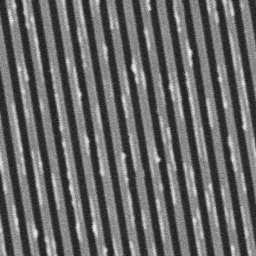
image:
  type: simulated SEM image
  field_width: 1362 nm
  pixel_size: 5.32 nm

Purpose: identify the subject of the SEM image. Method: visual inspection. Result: parallel lines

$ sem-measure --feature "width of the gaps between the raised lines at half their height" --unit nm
43.3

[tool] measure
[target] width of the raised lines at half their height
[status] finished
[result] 42.7 nanometres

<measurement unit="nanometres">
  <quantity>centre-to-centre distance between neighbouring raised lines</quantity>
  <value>87.6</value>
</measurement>